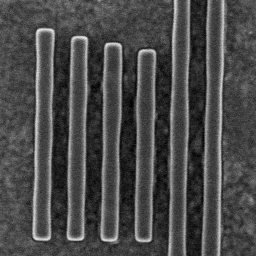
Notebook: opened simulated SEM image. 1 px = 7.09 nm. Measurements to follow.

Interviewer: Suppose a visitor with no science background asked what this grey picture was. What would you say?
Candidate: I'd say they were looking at groups of lines, slits or small figures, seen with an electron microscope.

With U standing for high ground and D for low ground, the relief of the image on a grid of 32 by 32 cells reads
DDDDDDDDDDDDDDDDDDDDDDUUDDUUDDDD
DDDDDDDDDDDDDDDDDDDDDDUUDDUUDDDD
DDDDDDDDDDDDDDDDDDDDDDUUDDUUDDDD
DDDDDDDDDDDDDDDDDDDDDDUUDDUUDDDD
DDDDDUUDDDDDDDDDDDDDDDUUDDUUDDDD
DDDDDUUDDUUDDUUDDDDDDDUUDDUUDDDD
DDDDDUUDDUUDDUUDDUUDDDUUDDUUDDDD
DDDDDUUDDUUDDUUDDUUDDDUUDDUUDDDD
DDDDDUUDDUUDDUUDDUUDDDUDDDUUDDDD
DDDDDUUDDUUDDUUDDUUDDDUDDDUUDDDD
DDDDDUUDDUUDDUUDDUUDDDUDDDUUDDDD
DDDDDUUDDUUDDUUDDUUDDUUDDDUUDDDD
DDDDDUDDDUUDDUUDDUUDDUUDDDUUDDDD
DDDDDUDDDUUDDUUDDUUDDUUDDDUUDDDD
DDDDUUDDDUUDDUUDDUUDDUUDDDUUDDDD
DDDDUUDDDUUDDUUDDUUDDUUDDDUUDDDD
DDDDUUDDDUUDDUUDDUUDDUUDDDUUDDDD
DDDDUUDDDUUDDUUDDUUDDUUDDDUUDDDD
DDDDUUDDDUUDDUUDDUUDDUUDDDUUDDDD
DDDDUUDDDUUDDUUDDUUDDUUDDDUUDDDD
DDDDUUDDDUUDDUUDDUUDDUUDDDUUDDDD
DDDDUUDDUUUDDUUDDUUDDUUDDDUUDDDD
DDDDUUDDUUUDDUUDDUUDDUUDDDUUDDDD
DDDDUUDDUUUDDUUDDUUDDUUDDDUUDDDD
DDDDUUDDDUUDDUUDDUUDDUUDDDUUDDDD
DDDDUUDDDUUDDUUDDUUDDUUDDDUUDDDD
DDDDUUDDDUUDDUUDDUUDDUUDDDUUDDDD
DDDDUUDDUUDDDUUDDUUDDUUDDUUUDDDD
DDDDUUDDUUUDDUUDDUUDDUUDDUUUDDDD
DDDDUUDDUUDDDUUDDUUDDUUDDUUUDDDD
DDDDDDDDDDDDDDDDDDDDDUUDDUUUDDDD
DDDDDDDDDDDDDDDDDDDDDUUDDUUDDDDD